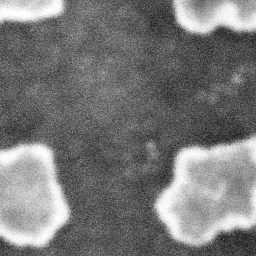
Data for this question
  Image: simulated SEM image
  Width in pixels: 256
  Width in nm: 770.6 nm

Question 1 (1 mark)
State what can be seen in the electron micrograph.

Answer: raised bodies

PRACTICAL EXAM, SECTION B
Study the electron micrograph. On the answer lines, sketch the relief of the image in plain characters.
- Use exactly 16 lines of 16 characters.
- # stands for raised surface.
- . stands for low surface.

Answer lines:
###........#####
............#..#
................
................
................
................
................
................
................
.##.........####
###........#####
###........#####
####......######
####......######
###........###..
................